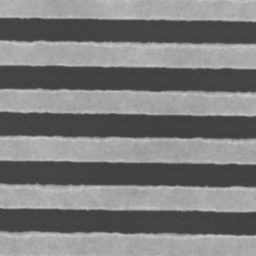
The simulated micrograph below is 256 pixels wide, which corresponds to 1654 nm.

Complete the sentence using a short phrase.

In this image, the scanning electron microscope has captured lines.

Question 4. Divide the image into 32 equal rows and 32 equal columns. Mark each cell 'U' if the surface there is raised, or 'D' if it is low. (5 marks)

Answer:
UUUUUUUUUUUUUUUUUUUUUUUUUUUUUUUU
UUUUUUUUUUUUUUUUUUUUUUUUUUUUUUUU
DDDDDDDDDDDDDDDDDDDDDDDUDDDUUUUU
DDDDDDDDDDDDDDDDDDDDDDDDDDDDDDDD
DDDDDDDDDDDDDDDDDDDDDDDDDDDDDDDD
UUUUUUUUUUUUUUUUUUUUUUUDDUDDDDDD
UUUUUUUUUUUUUUUUUUUUUUUUUUUUUUUU
UUUUUUUUUUUUUUUUUUUUUUUUUUUUUUUU
DDDDDDDDDDDDDDDDDDDDDDDDUDUUDUUU
DDDDDDDDDDDDDDDDDDDDDDDDDDDDDDDD
DDDDDDDDDDDDDDDDDDDDDDDDDDDDDDDD
UUUUUUUUUUUUUUUUUUDDUUDDDDDDDDDD
UUUUUUUUUUUUUUUUUUUUUUUUUUUUUUUU
UUUUUUUUUUUUUUUUUUUUUUUUUUUUUUUU
DDDDDDDDDDDDDDDDDDDDDDDDDDDDDDUU
DDDDDDDDDDDDDDDDDDDDDDDDDDDDDDDD
DDDDDDDDDDDDDDDDDDDDDDDDDDDDDDDD
UUUUUUUUUUUUUUUUUUUUUUUUUUUUUUUU
UUUUUUUUUUUUUUUUUUUUUUUUUUUUUUUU
UUUUUUUUUUUUUUUUUUUUUUUUUUUUUUUU
DDDDDDDDDDDDDDDDDDDDDDDDDDDDDDDD
DDDDDDDDDDDDDDDDDDDDDDDDDDDDDDDD
DDDDDDDDDDDDDDDDDDDDDDDDDDDDDDDD
UUUUUUUUUUUUUUUUUUUUUUUUUUUUUUUU
UUUUUUUUUUUUUUUUUUUUUUUUUUUUUUUU
UUUUUUUUUUUUUUUUUUUUUUUUUUUUUUUU
DDDDDDDDDDDDDDDDDDDDDDDDDDDDDDDD
DDDDDDDDDDDDDDDDDDDDDDDDDDDDDDDD
DDDDDDDDDDDDDDDDDDDDDDDDDDDDDDDD
UUUUUUUUUUUUUUUUUUUUUUUUUUUUUDUU
UUUUUUUUUUUUUUUUUUUUUUUUUUUUUUUU
UUUUUUUUUUUUUUUUUUUUUUUUUUUUUUUU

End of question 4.